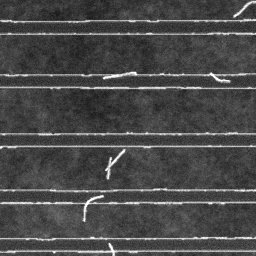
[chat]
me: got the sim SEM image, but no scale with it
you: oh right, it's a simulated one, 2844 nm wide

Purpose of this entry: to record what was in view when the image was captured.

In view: lines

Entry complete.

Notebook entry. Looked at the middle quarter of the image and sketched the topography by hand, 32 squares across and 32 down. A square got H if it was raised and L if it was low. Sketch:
LLLLLLLLLLLLLLLLLLLLLLLLLLLLLLLL
LLLLLLLLLLLLLLLLLLLLLLLLLLLLLLLL
LLLLLLLLLLLLLLLHHLLLLLLLLLLLLLLL
HHHHHHHHHHHHHHHHHHHHHHHHHHHHHHHH
HHHHHHHHHHHHHHHHHHHHHHHHHHHHHHHH
HHHHHHHHHHHHHHHHHHHHHHHHHHHHHHHH
LLLLLLLLLLLLLLLLLLLLLLLLLLLLLLLL
LLLLLLLLLLLLLLLLLLLLLLLLLLLLLLLL
LLLLLLLLLLLLLLLLLLLLLLLLLLLLLLLL
LLLLLLLLLLLLLLLLLLLLLLLLLLLLLLLL
LLLLLLLLLLLLLLLLLLLLLLLLLLLLLLLL
LLLLLLLLLLLLLLLLLLLLLLLLLLLLLLLL
LLLLLLLLLLLLLLLLLLLLLLLLLLLLLLLL
LLLLLLLLLLLLLLLLLLLLLLLLLLLLLLLL
LLLLLLLLLLLLLLLLLLLLLLLLLLLLLLLL
LLLLLLLLLLLLLLLLLLLLLLLLLLLLLLLL
LLLLLLLLLLLLLLLLLLLLLLLLLLLLLLLL
LLLLLLLLLLLLLLLHHHLLHLLLLLLLLLLL
HHHHHHHHHHHHHHHHHHHHHHHHHHHHHHHH
HHHHHHHHHHHHHHHHHHHHHHHHHHHHHHHH
HHHHHHHHHHHHHHHHHHHHHHHHHHHHHHHH
LLLLLLLLLLLLLLLLLLLLLLLLLLLLLLLL
LLLLLLLLLLLLLLLLLLLLLLLLLLLLLLLL
LLLLLLLLLLLLLLLLLLLLLLLLLLLLLLLL
LLLLLLLLLLLLLLLLLLLLLLLLLLLLLLLL
LLLLLLLLLLLLLLLLLLLLLLLLLLLLLLLL
LLLLLLLLLLLLLLLLLLLLLLLLLLLLLLLL
LLLLLLLLLLLLLLLLLLLLLLLLLLLLLLLL
LLLLLLLLLLLLLLLLLLLLLLLLLLLLLLLL
LLLLLLLLLLLLLLLLLLLLLLLLLLLLLLLL
LLLLLLLLLLLLLLLLLLLLLLLLLLLLLLLL
LLLLLLLLLLLLLLLLLLLLLLHHHHLLLLLL